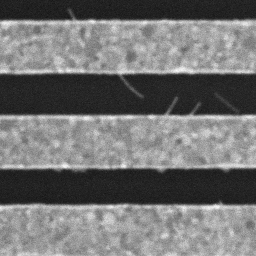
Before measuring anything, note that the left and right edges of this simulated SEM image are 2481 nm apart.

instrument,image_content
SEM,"lines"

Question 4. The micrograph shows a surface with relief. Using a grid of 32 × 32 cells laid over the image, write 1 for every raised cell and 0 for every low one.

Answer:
00000000000000000000000000000000
00000000000000000000000000000000
00000000010000000000000000000000
11111111111111111111111111111111
11111111111111111111111111111111
11111111111111111111111111111111
11111111111111111111111111111111
11111111111111111111111111111111
11111111111111111111111111111111
00000000000000000000000000000000
00000000000000000000000000000000
00000000000000000000000000000000
00000000000000000000000000000000
00000000000000000000000000000000
00001101100000001111110100100011
11111111111111111111111111111111
11111111111111111111111111111111
11111111111111111111111111111111
11111111111111111111111111111111
11111111111111111111111111111111
11111111111111111111111111111111
00000000000000000000000000000000
00000000000000000000000000000000
00000000000000000000000000000000
00000000000000000000000000000000
00000000000000000000000000000000
11111111111111111111111111111111
11111111111111111111111111111111
11111111111111111111111111111111
11111111111111111111111111111111
11111111111111111111111111111111
11111111111111111111111111111111